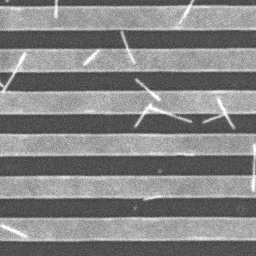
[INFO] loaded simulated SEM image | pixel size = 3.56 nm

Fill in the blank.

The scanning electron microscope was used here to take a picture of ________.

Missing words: wiring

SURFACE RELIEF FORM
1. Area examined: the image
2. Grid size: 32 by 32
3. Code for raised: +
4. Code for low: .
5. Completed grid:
................................
++++++++++++++++++++++++..++++++
++++++++++++++++++++++++++++++++
++++++++++++++++++++++++++++++++
................................
................................
++++++++++++++++++++++++++++++++
++++++++++++++++++++++++++++++++
+++++++++++++++++++++++++..+++++
................................
................................
++........++++++.+++++++++...+++
+.++++++++++++++++++++++++++++++
++++++++++++++++++++++++++++++++
................................
................................
................................
+++++++.+..+++++++..++++++.+++++
++++++++++++++++++++++++++++++++
................................
................................
................................
++++++++.+++++++++++++++++++++++
++++++++++++++++++++++++++++++++
+++++++++++++++++++++.++++++++++
................................
................................
+++++++++++++.++++..++++++++++++
++++.+++++++..++++++++++++++++++
++++++++++++.+++++++++++++++++++
................................
................................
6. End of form